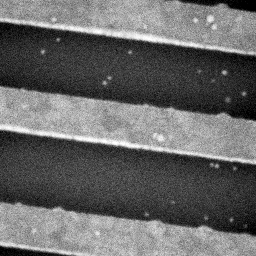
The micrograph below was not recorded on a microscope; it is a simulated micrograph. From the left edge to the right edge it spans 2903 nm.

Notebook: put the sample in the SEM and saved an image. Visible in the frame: lines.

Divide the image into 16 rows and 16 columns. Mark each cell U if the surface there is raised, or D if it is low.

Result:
UUUUUUUUUUUUUUDD
DDUUUUUUUUUUUUUU
DDDDDDDDDUUUUUUU
DDDDDDDDDDDDDDDD
DDDDDDDDDDDDDDDD
DDDDDDDDDDDDDDDD
UUUUUUUUDDDDDDDD
UUUUUUUUUUUUUUUD
DDDDUUUUUUUUUUUU
DDDDDDDDDDDUUUUU
DDDDDDDDDDDDDDDD
DDDDDDDDDDDDDDDD
DDDDDDDDDDDDDDDD
UUUUUUDDDDDDDDDD
UUUUUUUUUUUUUUDD
DUUUUUUUUUUUUUUU